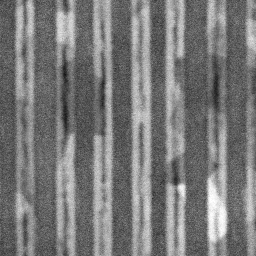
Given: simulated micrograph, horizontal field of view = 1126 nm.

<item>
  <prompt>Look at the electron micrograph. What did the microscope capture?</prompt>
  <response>parallel lines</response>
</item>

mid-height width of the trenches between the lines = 110 nm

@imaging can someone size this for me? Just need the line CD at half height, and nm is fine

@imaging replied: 60.5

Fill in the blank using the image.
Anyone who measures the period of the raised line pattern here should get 169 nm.